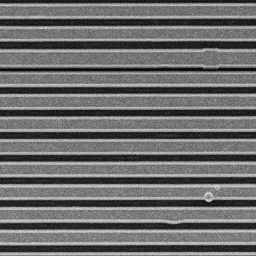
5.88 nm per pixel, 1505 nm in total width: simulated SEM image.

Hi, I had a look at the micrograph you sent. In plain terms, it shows parallel lines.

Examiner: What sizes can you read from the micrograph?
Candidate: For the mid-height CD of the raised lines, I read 75.6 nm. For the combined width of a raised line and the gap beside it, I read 133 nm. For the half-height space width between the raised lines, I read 54.3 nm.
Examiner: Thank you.